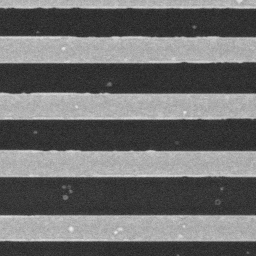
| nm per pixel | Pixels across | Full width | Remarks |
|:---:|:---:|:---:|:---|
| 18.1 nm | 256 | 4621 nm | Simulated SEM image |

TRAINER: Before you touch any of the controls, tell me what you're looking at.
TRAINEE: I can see lines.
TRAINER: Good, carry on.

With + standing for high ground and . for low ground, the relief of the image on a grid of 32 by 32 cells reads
++++++++++++++++++++++++++++++++
................................
................................
................................
................................
++++++++++++++++++++++++++++++++
++++++++++++++++++++++++++++++++
++++++++++++++++++++++++++++++++
................................
................................
................................
................................
++++++++++++++++++++++++++++++++
++++++++++++++++++++++++++++++++
++++++++++++++++++++++++++++++++
................................
................................
................................
................................
++++++++++++++++++++++++++++++++
++++++++++++++++++++++++++++++++
++++++++++++++++++++++++++++++++
................................
................................
................................
................................
................................
++++++++++++++++++++++++++++++++
++++++++++++++++++++++++++++++++
++++++++++++++++++++++++++++++++
................................
................................